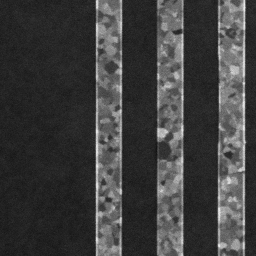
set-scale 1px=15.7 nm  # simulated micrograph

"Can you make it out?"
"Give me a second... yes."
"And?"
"one or a few lines or trenches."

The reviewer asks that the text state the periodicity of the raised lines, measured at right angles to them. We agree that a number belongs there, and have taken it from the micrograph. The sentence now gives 962 nm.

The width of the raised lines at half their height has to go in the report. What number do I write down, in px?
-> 24.7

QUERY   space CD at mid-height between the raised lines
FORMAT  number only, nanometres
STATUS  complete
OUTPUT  576